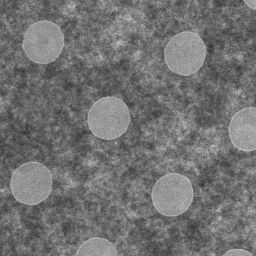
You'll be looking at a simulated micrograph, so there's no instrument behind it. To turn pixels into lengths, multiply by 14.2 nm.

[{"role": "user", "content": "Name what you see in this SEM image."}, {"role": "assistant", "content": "raised bodies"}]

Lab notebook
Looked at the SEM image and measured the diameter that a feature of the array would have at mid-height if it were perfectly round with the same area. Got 599 nm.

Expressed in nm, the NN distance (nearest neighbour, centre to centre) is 1430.